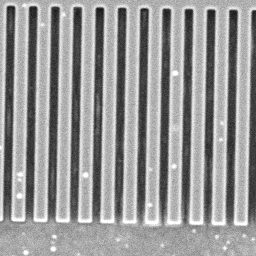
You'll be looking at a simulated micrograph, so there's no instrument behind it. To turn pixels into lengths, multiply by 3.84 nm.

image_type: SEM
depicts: groups of lines, slits or small figures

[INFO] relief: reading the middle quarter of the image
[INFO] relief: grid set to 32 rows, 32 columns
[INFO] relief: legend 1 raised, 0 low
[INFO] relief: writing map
11001110001110001110011100011100
11001110001110001110011100011100
11001110001110001110011100011100
11001110001110001110011100011100
11001110001110011110011100011100
11001110001110011110011100011100
11001110001110011110011100011100
11001110001110011110011100011100
11001110001110011110011100011100
11001110001110011110011100011000
11001110001110011110011100011000
11001110001110011100011100011000
11001110001110011100011100011000
11001110001110011100011100011000
11001110001110011100011100011000
11001110001110011100011100111000
11001110001110011100011100111000
11001110001110011100011100111000
11001110001110011100011100111000
10001110001110011100011100111000
10001110001110011100011100111000
10001110001110011100011100111000
10001110001110011100011100111000
10001110001110011100011100111000
10001110011110011100011100111000
10001110011110011100011100111000
10001110011110011100011100111000
10001110011110011100011100111000
10001110011110011100011100111000
10001110011110011100011100111000
10001110011100011100011100111000
10001110011100011100011100111000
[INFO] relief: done